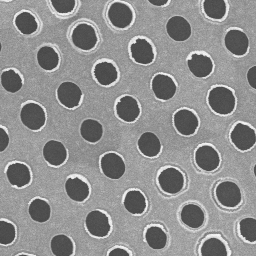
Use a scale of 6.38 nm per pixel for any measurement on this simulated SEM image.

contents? a regular array of holes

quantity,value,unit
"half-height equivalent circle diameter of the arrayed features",156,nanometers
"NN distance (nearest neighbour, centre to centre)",0.264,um